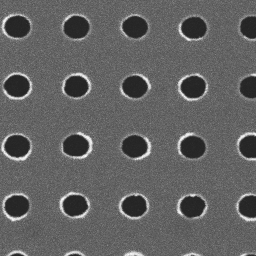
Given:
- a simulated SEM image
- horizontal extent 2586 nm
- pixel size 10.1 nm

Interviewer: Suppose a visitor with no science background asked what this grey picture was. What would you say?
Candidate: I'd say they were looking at a regular array of holes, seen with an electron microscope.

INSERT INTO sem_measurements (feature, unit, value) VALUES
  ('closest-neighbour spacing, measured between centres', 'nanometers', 591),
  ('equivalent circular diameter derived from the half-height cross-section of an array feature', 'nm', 245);